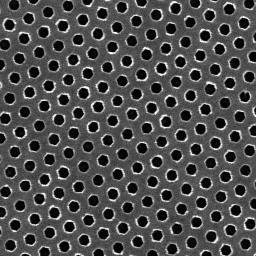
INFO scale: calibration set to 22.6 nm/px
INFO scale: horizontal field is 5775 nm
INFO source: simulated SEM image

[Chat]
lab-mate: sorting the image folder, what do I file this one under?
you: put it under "a regular array of holes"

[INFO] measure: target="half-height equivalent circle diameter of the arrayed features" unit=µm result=0.24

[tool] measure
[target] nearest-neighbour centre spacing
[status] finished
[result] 451 nm